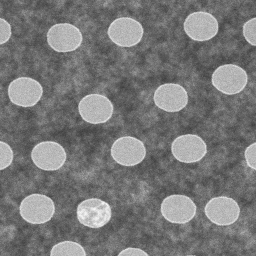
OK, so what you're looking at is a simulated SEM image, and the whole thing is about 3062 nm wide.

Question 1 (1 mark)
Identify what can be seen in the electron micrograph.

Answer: a regular array of raised bodies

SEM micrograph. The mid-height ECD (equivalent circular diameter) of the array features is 373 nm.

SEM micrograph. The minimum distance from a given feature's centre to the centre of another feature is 0.65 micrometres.